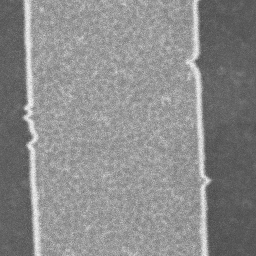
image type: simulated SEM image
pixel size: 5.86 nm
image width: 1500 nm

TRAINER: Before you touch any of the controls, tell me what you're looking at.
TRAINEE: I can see one or a few lines or trenches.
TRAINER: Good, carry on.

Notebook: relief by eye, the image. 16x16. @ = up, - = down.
--@@@@@@@@@@----
--@@@@@@@@@@----
--@@@@@@@@@@----
--@@@@@@@@@@----
--@@@@@@@@@@----
--@@@@@@@@@@----
--@@@@@@@@@@----
--@@@@@@@@@@----
--@@@@@@@@@@@---
--@@@@@@@@@@@---
--@@@@@@@@@@@---
--@@@@@@@@@@@---
--@@@@@@@@@@@---
--@@@@@@@@@@@---
--@@@@@@@@@@@---
--@@@@@@@@@@@---